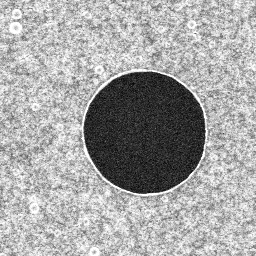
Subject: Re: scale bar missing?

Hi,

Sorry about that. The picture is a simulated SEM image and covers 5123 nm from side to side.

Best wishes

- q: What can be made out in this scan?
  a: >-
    holes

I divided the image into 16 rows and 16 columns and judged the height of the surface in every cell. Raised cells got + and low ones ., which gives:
++++++++++++++++
++++++++++++++++
++++++++++++++++
++++++++++++++++
++++++++..++++++
++++++......++++
++++++.......+++
+++++........+++
+++++........+++
+++++........+++
++++++......++++
+++++++....+++++
++++++++++++++++
++++++++++++++++
++++++++++++++++
++++++++++++++++